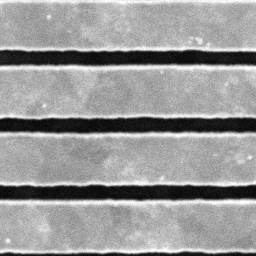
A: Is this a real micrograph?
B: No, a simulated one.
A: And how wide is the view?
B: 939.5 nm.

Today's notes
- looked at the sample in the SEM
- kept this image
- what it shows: lines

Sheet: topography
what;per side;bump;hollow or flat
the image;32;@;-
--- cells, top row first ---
@@@@@@@@@@@@@@@@@@@@@@@@@@@@@@@@
@@@@@@@@@@@@@@@@@@@@@@@@@@@@@@@@
@@@@@@@@@@@@@@@@@@@@@@@@@@@@@@@@
@@@@@@@@@@@@@@@@@@@@@@@@@@@@@@@@
@@@@@@@@@@@@@@@@@@@@@@@@@@@@@@@@
@@@@@@@@@@@@@@@@@@@@@@@@@@@@@@@@
--------------------------------
--------------------------------
@@@@@@@@@@@@@@@@@@@@@@@@@@@@@@@@
@@@@@@@@@@@@@@@@@@@@@@@@@@@@@@@@
@@@@@@@@@@@@@@@@@@@@@@@@@@@@@@@@
@@@@@@@@@@@@@@@@@@@@@@@@@@@@@@@@
@@@@@@@@@@@@@@@@@@@@@@@@@@@@@@@@
@@@@@@@@@@@@@@@@@@@@@@@@@@@@@@@@
@@@@@@@@@@@@@@@@@@@@@@@@@@@@@@@@
--------------------------------
--------------------------------
@@@@@@@@@@@@@@@@@@@@@@@@@@@@@@@@
@@@@@@@@@@@@@@@@@@@@@@@@@@@@@@@@
@@@@@@@@@@@@@@@@@@@@@@@@@@@@@@@@
@@@@@@@@@@@@@@@@@@@@@@@@@@@@@@@@
@@@@@@@@@@@@@@@@@@@@@@@@@@@@@@@@
@@@@@@@@@@@@@@@@@@@@@@@@@@@@@@@@
--------------------------------
--------------------------------
@@@@@@@@@@@@@@@@@@@@@@@@@@@@@@@@
@@@@@@@@@@@@@@@@@@@@@@@@@@@@@@@@
@@@@@@@@@@@@@@@@@@@@@@@@@@@@@@@@
@@@@@@@@@@@@@@@@@@@@@@@@@@@@@@@@
@@@@@@@@@@@@@@@@@@@@@@@@@@@@@@@@
@@@@@@@@@@@@@@@@@@@@@@@@@@@@@@@@
@@@@@@@@@@@@@@@@@@@@@@@--@@@@@@@